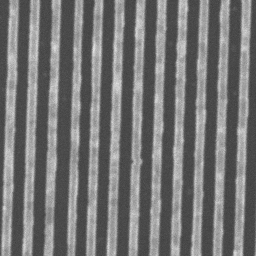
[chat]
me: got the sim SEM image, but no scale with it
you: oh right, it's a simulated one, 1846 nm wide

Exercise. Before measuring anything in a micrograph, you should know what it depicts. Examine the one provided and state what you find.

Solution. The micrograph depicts parallel lines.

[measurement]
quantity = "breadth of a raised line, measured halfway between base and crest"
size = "46.8 nm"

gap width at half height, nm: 105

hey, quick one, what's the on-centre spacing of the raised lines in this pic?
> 0.152 micrometres